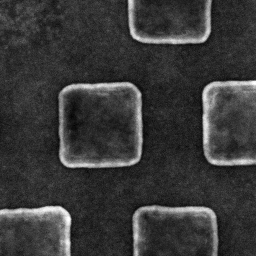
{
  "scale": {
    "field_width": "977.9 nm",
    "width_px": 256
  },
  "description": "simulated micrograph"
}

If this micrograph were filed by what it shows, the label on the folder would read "raised bodies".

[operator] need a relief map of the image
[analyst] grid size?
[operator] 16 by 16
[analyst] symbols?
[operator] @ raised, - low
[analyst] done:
--------@@@@@---
--------@@@@@---
---------@@@@---
----------------
----------------
----@@@@-----@@@
----@@@@@----@@@
----@@@@@----@@@
----@@@@@----@@@
----@@@@@----@@@
----------------
----------------
----------------
@@@@-----@@@@---
@@@@----@@@@@---
@@@@----@@@@@---